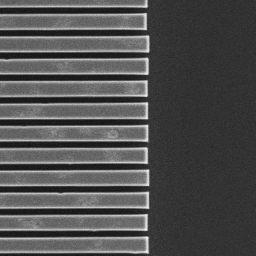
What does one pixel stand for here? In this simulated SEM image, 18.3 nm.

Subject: parallel lines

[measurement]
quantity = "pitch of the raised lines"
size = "0.409 micrometres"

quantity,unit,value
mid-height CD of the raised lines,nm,284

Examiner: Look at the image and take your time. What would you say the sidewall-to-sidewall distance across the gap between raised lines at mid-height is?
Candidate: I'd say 117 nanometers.